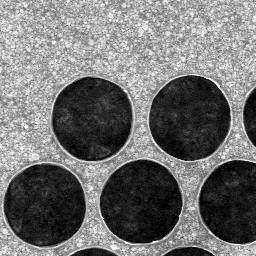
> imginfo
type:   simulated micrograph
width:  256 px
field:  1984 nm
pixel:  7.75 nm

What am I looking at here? holes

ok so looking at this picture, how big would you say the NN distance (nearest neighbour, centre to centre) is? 748 nm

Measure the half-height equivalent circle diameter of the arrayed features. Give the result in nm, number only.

644